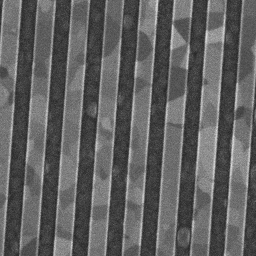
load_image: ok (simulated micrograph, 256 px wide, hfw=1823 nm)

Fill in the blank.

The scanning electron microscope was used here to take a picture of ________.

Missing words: parallel lines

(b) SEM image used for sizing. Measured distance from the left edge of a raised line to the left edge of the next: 243 nm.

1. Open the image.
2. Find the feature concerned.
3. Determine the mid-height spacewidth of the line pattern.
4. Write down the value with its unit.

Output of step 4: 119 nanometers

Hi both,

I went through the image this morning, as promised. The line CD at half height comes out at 125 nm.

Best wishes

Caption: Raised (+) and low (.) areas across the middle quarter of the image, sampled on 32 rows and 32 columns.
.++++....+++++....++++....+++++.
.++++....+++++....++++....+++++.
.++++....++++.....++++...++++++.
.++++....++++.....++++....++++++
.++++....++++...+.++++..+.+++++.
+++++....++++.....++++.++.++++..
+++++....++++.....++++.+..++++..
+++++....+++++++..++++....++++..
+++++....++++++..+++++..+.++++..
+++++....++++....+++++..+.++++..
+++++.+++++++....+++++..+.++++..
++++..+++++++....++++.+...++++..
++++..++.++++....+++++....++++..
++++.....++++....++++....+++++..
++++....+++++....++++....+++++..
++++....+++++....++++....+++++..
++++....++++.....++++....+++++..
++++....++++.....++++....+++++..
++++....++++.....++++....+++++..
++++....++++.....++++....++++...
++++....++++.....++++....++++...
++++....++++.+...++++....++++...
++++....++++....+++++....++++...
++++....++++....+++++.+..++++...
++++....++++....+++++++..++++...
+++.....++++....++++.....++++...
+++.....+++++...++++.....++++...
+++.....+++++...++++....+++++...
+++....+++++....++++....+++++...
+++....+++++....++++....+++++...
+++....++++.....++++....+++++...
+++....++++.....++++....+++++...